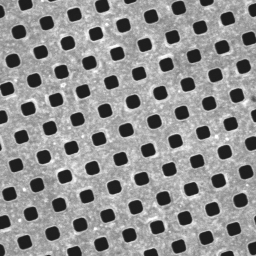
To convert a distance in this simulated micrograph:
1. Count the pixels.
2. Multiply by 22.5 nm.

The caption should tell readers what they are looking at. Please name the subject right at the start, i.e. a regular array of holes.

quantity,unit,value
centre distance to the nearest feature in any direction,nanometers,648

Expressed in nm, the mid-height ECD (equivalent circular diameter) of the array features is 328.